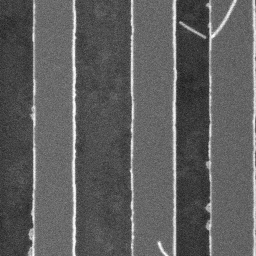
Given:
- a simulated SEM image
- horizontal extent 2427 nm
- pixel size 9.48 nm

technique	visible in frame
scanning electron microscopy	lines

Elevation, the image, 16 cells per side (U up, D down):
DDUUUDDDUUUDDUUU
DDUUUDDDUUUDDUUU
DDUUUDDDUUUDDUUU
DDUUUDDDUUUDDUUU
DDUUUDDDUUUDDUUU
DDUUUDDDUUUDDUUU
DDUUUDDDUUUDDUUU
DDUUUDDDUUUDDUUU
DDUUUDDDUUUDDUUU
DDUUUDDDUUUDDUUU
DDUUUDDDUUUDDUUU
DDUUUDDDUUUDDUUU
DDUUUDDDUUUDDUUU
DDUUUDDDUUUDDUUU
DDUUUDDDUUUDDUUU
DDUUUDDDUUUDDUUU